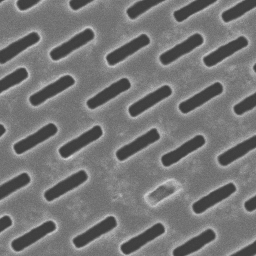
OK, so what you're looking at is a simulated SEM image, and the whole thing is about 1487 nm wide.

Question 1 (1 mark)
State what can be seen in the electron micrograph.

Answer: a regular array of holes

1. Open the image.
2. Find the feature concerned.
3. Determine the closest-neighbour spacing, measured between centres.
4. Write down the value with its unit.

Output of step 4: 270 nm